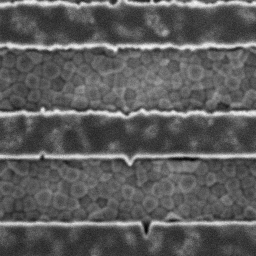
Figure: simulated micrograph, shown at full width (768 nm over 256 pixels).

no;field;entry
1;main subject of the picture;one or a few lines or trenches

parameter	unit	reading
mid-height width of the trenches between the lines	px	65.9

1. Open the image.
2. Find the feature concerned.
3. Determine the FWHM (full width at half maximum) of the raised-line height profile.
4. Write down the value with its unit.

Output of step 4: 134 nanometres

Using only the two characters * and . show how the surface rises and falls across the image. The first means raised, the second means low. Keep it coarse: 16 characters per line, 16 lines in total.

****************
****************
****************
................
................
................
................
****************
****************
****************
................
................
................
................
****************
****************